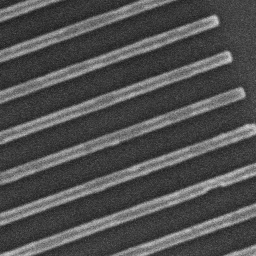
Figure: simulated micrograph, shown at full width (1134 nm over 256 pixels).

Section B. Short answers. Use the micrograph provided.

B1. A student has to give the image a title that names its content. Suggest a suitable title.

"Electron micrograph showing parallel lines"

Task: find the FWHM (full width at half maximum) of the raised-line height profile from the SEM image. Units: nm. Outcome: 48.4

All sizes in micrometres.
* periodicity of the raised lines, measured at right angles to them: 0.17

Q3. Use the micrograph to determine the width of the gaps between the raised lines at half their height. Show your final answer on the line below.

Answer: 0.121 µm